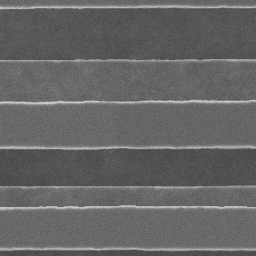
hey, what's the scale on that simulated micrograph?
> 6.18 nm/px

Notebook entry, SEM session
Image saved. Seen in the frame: lines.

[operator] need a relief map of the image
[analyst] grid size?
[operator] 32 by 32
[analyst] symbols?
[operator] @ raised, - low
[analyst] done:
@@@@@@@@@@@@@@@@@@@@@@@@@@@@@@@@
--------------------------------
--------------------------------
--------------------------------
--------------------------------
--------------------------------
--------------------------------
--------------------------@@@@@-
@@@@@@@@@@@@@@@@@@@@@@@@@@@@@@@@
@@@@@@@@@@@@@@@@@@@@@@@@@@@@@@@@
@@@@@@@@@@@@@@@@@@@@@@@@@@@@@@@@
@@@@@@@@@@@@@@@@@@@@@@@@@@@@@@@@
@@@@@@@@@@@@@@@@@@@@@@@@@@@@@@@@
@@@@@@@@@@@@@@@@@@@@@@@@@@@@@@@@
@@@@@@@@@@@@@@@@@@@@@@@@@@@@@@@@
@@@@@@@@@@@@@@@@@@@@@@@@@@@@@@@@
@@@@@@@@@@@@@@@@@@@@@@@@@@@@@@@@
@@@@@@@@@@@@@@@@@@@@@@@@@@@@@@@@
@@@@@@@@@@@@@@---@---@----------
--------------------------------
--------------------------------
--------------------------------
--------------------------------
@@@@@@@@@@@@@@@@@@@@@@@@@@@@@@@@
@@@@@@@@@@@@@@@@@@@@@@@@@@@@@@@@
@@@@@@@@@@@@@@@@@@@@@@@@@@@@@@@@
@@@@@@@@@@@@@@@@@@@@@@@@@@@@@@@@
@@@@@@@@@@@@@@@@@@@@@@@@@@@@@@@@
@@@@@@@@@@@@@@@@@@@@@@@@@@@@@@@@
@@@@@@@@@@@@@@@@@@@@@@@@@@@@@@@@
@@@@@@@@@@@@@@@@@@@@@@@@@@@@@@@@
--------------------------------